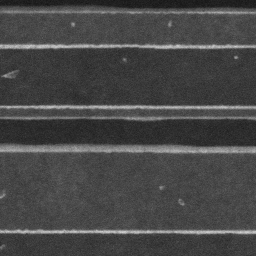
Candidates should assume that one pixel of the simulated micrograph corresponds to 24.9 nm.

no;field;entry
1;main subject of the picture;lines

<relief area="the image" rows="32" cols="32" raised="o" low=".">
................................
oooooooooooooooooooooooooooooooo
oooooooooooooooooooooooooooooooo
oooooooooooooooooooooooooooooooo
oooooooooooooooooooooooooooooooo
oooooooooooooooooooooooooooooooo
................................
................................
................................
................................
................................
................................
................................
oooooooooooooo.ooooooo..........
oooooooooooooooooooooooooooooooo
................................
................................
................................
................................
oooooooooooooooooooooooooooooooo
oooooooooooooooooooooooooooooooo
oooooooooooooooooooooooooooooooo
oooooooooooooooooooooooooooooooo
oooooooooooooooooooooooooooooooo
oooooooooooooooooooooooooooooooo
oooooooooooooooooooooooooooooooo
oooooooooooooooooooooooooooooooo
oooooooooooooooooooooooooooooooo
oooooooooooooooooooooooooooooooo
................................
................................
................................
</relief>